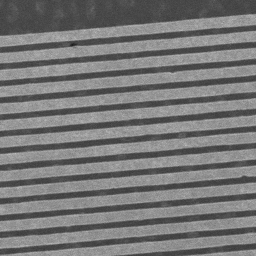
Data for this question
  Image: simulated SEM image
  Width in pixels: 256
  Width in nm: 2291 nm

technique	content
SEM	parallel lines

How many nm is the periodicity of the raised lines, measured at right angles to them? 150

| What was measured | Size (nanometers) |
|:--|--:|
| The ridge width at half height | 84.7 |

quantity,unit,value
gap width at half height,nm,65.7